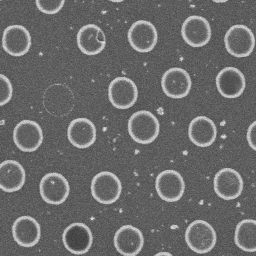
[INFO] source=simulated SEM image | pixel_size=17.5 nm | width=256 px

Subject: a regular array of raised bodies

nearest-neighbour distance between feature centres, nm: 916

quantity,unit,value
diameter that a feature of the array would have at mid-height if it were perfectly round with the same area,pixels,28.1